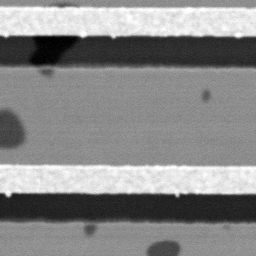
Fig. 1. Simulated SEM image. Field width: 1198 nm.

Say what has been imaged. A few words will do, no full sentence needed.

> lines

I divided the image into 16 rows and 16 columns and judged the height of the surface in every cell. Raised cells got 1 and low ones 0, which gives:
1111111111111111
1111111111111111
0000000000000000
0000000000000000
1111111111111111
1111111111111111
1111111111111111
1111111111111111
1111111111111111
1111111111111111
1111111111111111
1111111111111111
0000000000000000
0000000000000000
1111111111111111
1111111111111111